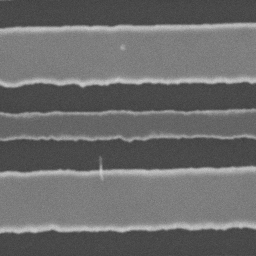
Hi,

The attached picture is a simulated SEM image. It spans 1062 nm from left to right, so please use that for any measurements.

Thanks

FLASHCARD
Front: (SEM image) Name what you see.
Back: lines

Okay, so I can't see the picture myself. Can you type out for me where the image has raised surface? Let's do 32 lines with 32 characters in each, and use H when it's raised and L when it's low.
LLLLLLLLLLLLLLLLLLLLLLLLLLLLLLLL
LLLLLLLLLLLLLLLLLLLLLLLLLLLLLLLL
LLLLLLLLLLLLLLLLLLLLLLLLLLLLLLLL
LLLLLLLHHHHHHHHHHHHHHHHHHHHHHHHH
HHHHHHHHHHHHHHHHHHHHHHHHHHHHHHHH
HHHHHHHHHHHHHHHHHHHHHHHHHHHHHHHH
HHHHHHHHHHHHHHHHHHHHHHHHHHHHHHHH
HHHHHHHHHHHHHHHHHHHHHHHHHHHHHHHH
HHHHHHHHHHHHHHHHHHHHHHHHHHHHHHHH
HHHHHHHHHHHHHHHHHHHHHHHHHHHHHHHH
HHHHLLLHHLHHHLLLLLLLLLLLLLLLLLLL
LLLLLLLLLLLLLLLLLLLLLLLLLLLLLLLL
LLLLLLLLLLLLLLLLLLLLLLLLLLLLLLLL
LLLLLLLLLLLLLLLLLLLLLLLLLLLLLLLL
HHHHHHHHHHHHHHHHHHHHHHHHHHHHHHHH
HHHHHHHHHHHHHHHHHHHHHHHHHHHHHHHH
HHHHHHHHHHHHHHHHHHHHHHHHHHHHHHHH
HLLLLLLLLLLLLLLLHLLLLLLLLLLLLLLL
LLLLLLLLLLLLLLLLLLLLLLLLLLLLLLLL
LLLLLLLLLLLLLLLLLLLLLLLLLLLLLLLL
LLLLLLLLLLLLLLLLLLLLLLLLLLLLLLLL
LLLLHHHHHHLHHHHHHHHHHHHHHHHHHHHH
HHHHHHHHHHHHHHHHHHHHHHHHHHHHHHHH
HHHHHHHHHHHHHHHHHHHHHHHHHHHHHHHH
HHHHHHHHHHHHHHHHHHHHHHHHHHHHHHHH
HHHHHHHHHHHHHHHHHHHHHHHHHHHHHHHH
HHHHHHHHHHHHHHHHHHHHHHHHHHHHHHHH
HHHHHHHHHHHHHHHHHHHHHHHHHHHHHHHH
HHHHHHHHHHHHHHHHHHHHHLLHHLLHLLLL
LLLLLLLLLLLLLLLLLLLLLLLLLLLLLLLL
LLLLLLLLLLLLLLLLLLLLLLLLLLLLLLLL
LLLLLLLLLLLLLLLLLLLLLLLLLLLLLLLL